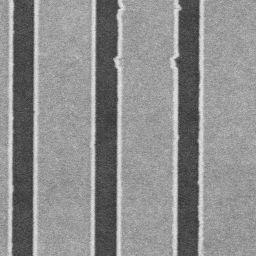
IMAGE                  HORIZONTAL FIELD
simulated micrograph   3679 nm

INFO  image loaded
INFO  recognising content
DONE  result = one or a few lines or trenches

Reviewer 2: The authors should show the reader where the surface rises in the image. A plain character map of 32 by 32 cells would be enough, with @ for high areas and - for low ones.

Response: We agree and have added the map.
@----@@@@@@@---@@@@@@@---@@@@@@@
@----@@@@@@@---@@@@@@@---@@@@@@@
@----@@@@@@@---@@@@@@@---@@@@@@@
@----@@@@@@@---@@@@@@@---@@@@@@@
@----@@@@@@@---@@@@@@@---@@@@@@@
@----@@@@@@@---@@@@@@@---@@@@@@@
@----@@@@@@@---@@@@@@@---@@@@@@@
@----@@@@@@@---@@@@@@@---@@@@@@@
@----@@@@@@@---@@@@@@@---@@@@@@@
@----@@@@@@@---@@@@@@@---@@@@@@@
@----@@@@@@@---@@@@@@@---@@@@@@@
@----@@@@@@@---@@@@@@@---@@@@@@@
@---@@@@@@@@---@@@@@@@---@@@@@@@
@---@@@@@@@@---@@@@@@@---@@@@@@@
@---@@@@@@@@---@@@@@@@---@@@@@@@
@---@@@@@@@@---@@@@@@@---@@@@@@@
@---@@@@@@@@---@@@@@@@---@@@@@@@
@---@@@@@@@@---@@@@@@@---@@@@@@@
@---@@@@@@@@---@@@@@@@---@@@@@@@
@---@@@@@@@@---@@@@@@@---@@@@@@@
@---@@@@@@@@---@@@@@@@---@@@@@@@
@---@@@@@@@@---@@@@@@@---@@@@@@@
@---@@@@@@@@---@@@@@@@---@@@@@@@
@---@@@@@@@@---@@@@@@@---@@@@@@@
@---@@@@@@@@---@@@@@@@---@@@@@@@
@---@@@@@@@@---@@@@@@@---@@@@@@@
@---@@@@@@@@---@@@@@@@---@@@@@@@
@---@@@@@@@@---@@@@@@@---@@@@@@@
@---@@@@@@@@---@@@@@@@---@@@@@@@
@---@@@@@@@@---@@@@@@@---@@@@@@@
@---@@@@@@@@---@@@@@@@---@@@@@@@
@---@@@@@@@@---@@@@@@@---@@@@@@@